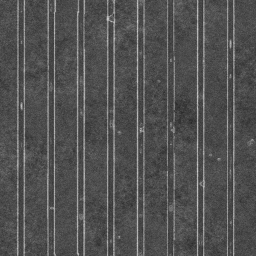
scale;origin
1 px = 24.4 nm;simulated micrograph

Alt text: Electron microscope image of parallel lines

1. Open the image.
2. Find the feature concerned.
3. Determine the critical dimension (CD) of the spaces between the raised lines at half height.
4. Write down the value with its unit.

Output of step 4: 0.144 microns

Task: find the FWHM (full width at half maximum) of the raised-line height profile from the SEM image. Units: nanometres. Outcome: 574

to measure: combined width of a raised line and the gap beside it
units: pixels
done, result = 30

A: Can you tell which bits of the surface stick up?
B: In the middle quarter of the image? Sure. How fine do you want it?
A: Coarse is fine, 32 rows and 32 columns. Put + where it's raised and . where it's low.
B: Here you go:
+++..++++++..+++++..++++++..++++
+++..++++++..+++++..++++++..++++
+++..++++++..+++++..++++++..++++
+++..++++++..+++++..++++++..++++
+++..++++++..+++++..++++++..++++
+++..++++++..+++++..++++++..++++
+++..++++++..+++++..++++++..++++
+++..++++++..+++++..++++++..++++
+++..++++++..+++++..++++++..++++
+++..++++++..+++++..++++++..++++
+++..++++++..+++++..++++++..++++
+++..++++++..+++++..++++++..++++
+++..++++++..+++++..++++++..++++
+++..++++++..+++++..++++++..++++
+++..++++++..+++++..++++++..++++
+++..++++++..+++++..++++++..++++
+++..++++++..+++++..++++++..++++
+++..++++++..+++++..++++++..++++
+++..++++++..+++++..++++++..++++
+++..++++++..+++++..++++++..++++
+++..++++++..+++++..++++++..++++
+++..++++++..+++++..++++++..++++
+++..++++++..+++++..++++++..++++
+++..++++++..+++++..++++++..++++
+++..++++++..+++++..++++++..++++
+++..++++++..+++++..++++++..++++
+++..++++++..+++++..++++++..++++
+++..++++++..+++++..++++++..++++
+++..++++++..+++++..++++++..++++
+++..++++++..+++++..++++++..++++
+++..++++++..+++++..++++++..++++
+++..++++++..+++++..++++++..++++